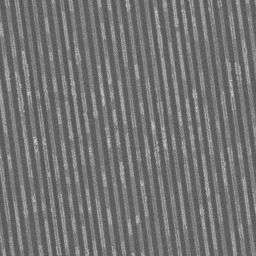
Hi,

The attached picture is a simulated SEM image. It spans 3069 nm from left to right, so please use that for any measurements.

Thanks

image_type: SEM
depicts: parallel lines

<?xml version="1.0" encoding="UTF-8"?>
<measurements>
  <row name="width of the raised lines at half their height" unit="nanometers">40.1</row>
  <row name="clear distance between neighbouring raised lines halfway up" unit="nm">71.2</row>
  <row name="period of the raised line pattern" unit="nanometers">110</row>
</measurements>